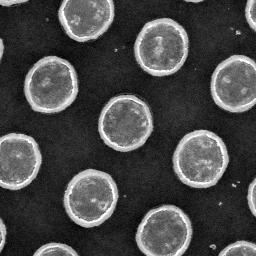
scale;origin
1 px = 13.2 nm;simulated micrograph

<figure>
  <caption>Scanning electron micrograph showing raised bodies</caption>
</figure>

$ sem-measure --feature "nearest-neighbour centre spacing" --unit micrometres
1.1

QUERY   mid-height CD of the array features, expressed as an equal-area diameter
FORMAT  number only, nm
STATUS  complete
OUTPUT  681